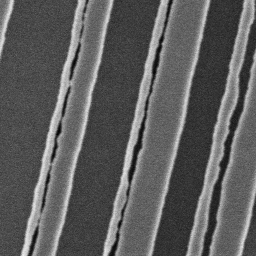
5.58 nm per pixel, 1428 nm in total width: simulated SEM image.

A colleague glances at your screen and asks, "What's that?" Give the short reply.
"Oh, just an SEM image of lines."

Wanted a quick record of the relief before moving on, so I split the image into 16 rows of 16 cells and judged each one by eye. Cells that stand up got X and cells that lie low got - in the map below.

X----XX---XXX--X
-----XX---XXX--X
----XX----XXX--X
----XX---XXX---X
----XX---XXX--XX
----XX---XXX--XX
----XX---XXX--XX
---XX---XXX---XX
---XX---XXX--XXX
---XX---XXX--XXX
---XX---XXX--XXX
--XX----XX---XXX
--XX---XXX---XXX
--XX---XXX--XXXX
--XX---XXX--XXX-
--X----XXX--XXX-